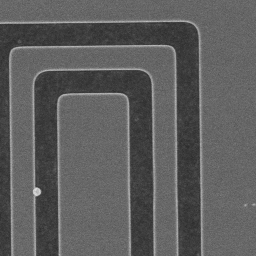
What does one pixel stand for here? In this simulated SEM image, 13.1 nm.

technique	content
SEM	groups of lines, slits or small figures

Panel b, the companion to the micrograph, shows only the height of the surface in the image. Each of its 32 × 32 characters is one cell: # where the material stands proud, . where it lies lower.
################################
################################
################################
.........................#######
.........................#######
.........................#######
.#####################...#######
.#####################...#######
.#####################...#######
.####..............###...#######
.###...............###...#######
.###...............###...#######
.###...#########...###...#######
.###...#########...###...#######
.###...#########...###...#######
.###...#########...###...#######
.###...#########...###...#######
.###...#########...###...#######
.###...#########...###...#######
.###...#########...###...#######
.####..#########...###...#######
.###...#########...###...#######
.###...#########...###...#######
.####..#########...###...#######
.####..#########...###...#######
.###...#########...###...#######
.###...#########...###...#######
.###...#########...###...#######
.###...#########...###...#######
.###...#########...###...#######
.###...#########...###...#######
.###...#########...###...#######